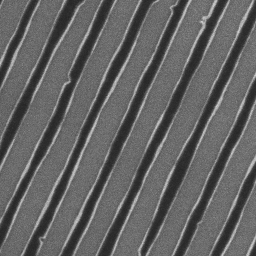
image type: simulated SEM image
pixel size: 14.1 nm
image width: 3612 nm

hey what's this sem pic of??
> parallel lines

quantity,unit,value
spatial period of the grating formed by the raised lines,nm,480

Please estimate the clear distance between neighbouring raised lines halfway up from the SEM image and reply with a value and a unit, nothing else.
0.309 micrometres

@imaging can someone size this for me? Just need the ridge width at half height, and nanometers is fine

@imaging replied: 178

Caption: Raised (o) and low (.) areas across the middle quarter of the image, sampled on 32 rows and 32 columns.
..ooo......oooo......ooo......oo
..ooo......oooo.....oooo......oo
.ooo......oooo......ooo.......oo
.ooo......oooo.....oooo......ooo
.oo.......ooo......ooo.......ooo
ooo......oooo.....oooo......ooo.
ooo......ooo......ooo......oooo.
oo......ooo......oooo......ooo..
oo......ooo......ooo.......ooo..
oo......oo.......ooo......ooo...
o......ooo......oooo......ooo...
o.....ooo.......ooo......oooo...
......ooo......oooo......ooo....
.....ooo.......ooo......oooo....
.....ooo......oooo......ooo.....
.....ooo......ooo......oooo.....
....ooo......oooo......ooo......
....ooo......oooo.....oooo......
...ooo.......ooo......ooo......o
...ooo......ooo......oooo......o
...oo.......ooo......ooo......oo
..ooo......oooo.....oooo......oo
..oo.......ooo......ooo......ooo
.ooo.......ooo......ooo......ooo
.ooo......ooo......ooo......oooo
ooo.......ooo......ooo......oooo
ooo......ooo......ooo......oooo.
oo.......ooo......ooo......oooo.
oo......ooo......ooo......oooo..
o.......ooo......ooo......oooo..
o.......oo.......ooo.....oooo...
o......ooo......ooo......oooo...